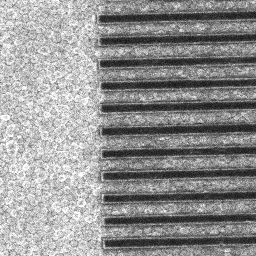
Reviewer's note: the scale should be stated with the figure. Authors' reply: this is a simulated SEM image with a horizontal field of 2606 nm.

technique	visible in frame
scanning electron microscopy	parallel lines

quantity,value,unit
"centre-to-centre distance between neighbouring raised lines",229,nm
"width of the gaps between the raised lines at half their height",136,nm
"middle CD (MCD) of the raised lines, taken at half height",96.7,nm